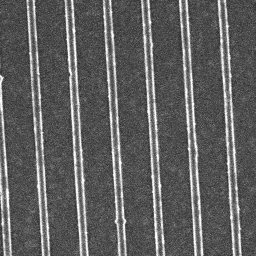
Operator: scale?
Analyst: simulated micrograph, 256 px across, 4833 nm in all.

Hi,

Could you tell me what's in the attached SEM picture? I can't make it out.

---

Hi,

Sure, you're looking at parallel lines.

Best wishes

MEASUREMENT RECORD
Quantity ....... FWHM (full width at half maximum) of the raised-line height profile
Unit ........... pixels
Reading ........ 7.24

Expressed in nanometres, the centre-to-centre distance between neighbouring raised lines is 721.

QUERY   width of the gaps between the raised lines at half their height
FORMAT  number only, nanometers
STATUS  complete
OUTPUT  582